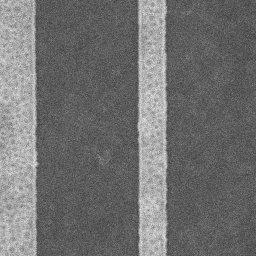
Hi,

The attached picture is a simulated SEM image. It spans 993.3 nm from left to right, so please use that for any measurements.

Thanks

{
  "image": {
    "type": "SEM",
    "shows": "one or a few lines or trenches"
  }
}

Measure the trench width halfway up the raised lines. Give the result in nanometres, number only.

414